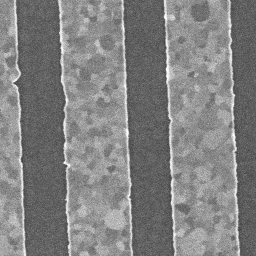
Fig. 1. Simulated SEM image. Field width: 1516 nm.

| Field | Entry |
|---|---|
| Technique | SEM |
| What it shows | one or a few lines or trenches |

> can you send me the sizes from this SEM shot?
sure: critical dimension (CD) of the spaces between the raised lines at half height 256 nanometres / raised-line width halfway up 0.377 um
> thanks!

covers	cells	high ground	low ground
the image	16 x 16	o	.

o...oooo..oooo..
o...oooo..oooo..
o...oooo..oooo..
o...oooo..oooo..
o...oooo..oooo..
o...oooo...oooo.
o...oooo...oooo.
o...oooo...oooo.
o...oooo...oooo.
o...oooo...oooo.
o...oooo...oooo.
o...oooo...oooo.
o...oooo...oooo.
o...oooo...oooo.
o...oooo...oooo.
o...oooo...oooo.